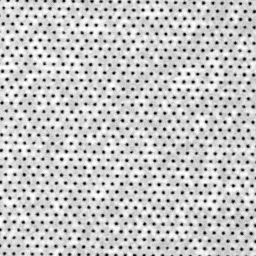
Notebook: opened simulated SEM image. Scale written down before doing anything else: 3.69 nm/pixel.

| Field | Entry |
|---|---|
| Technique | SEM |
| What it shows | a regular array of holes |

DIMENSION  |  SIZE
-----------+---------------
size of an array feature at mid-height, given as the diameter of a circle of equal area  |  13.2 nm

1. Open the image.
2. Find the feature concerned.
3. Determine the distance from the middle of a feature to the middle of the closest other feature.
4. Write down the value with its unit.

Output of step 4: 33 nm